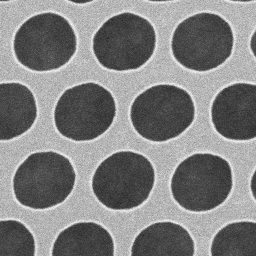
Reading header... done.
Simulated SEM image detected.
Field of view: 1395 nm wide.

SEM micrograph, a regular array of holes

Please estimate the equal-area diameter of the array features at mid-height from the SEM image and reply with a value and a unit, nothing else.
330 nm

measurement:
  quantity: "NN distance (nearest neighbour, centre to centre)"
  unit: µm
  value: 0.425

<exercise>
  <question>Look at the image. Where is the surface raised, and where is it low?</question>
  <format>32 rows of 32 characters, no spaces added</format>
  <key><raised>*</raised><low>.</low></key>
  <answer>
********************************
********************************
***.....*****.....*****.....****
**.......***.......***.......***
**.......***.......***.......***
**........**.......**........**.
**.......***.......***.......***
**.......***.......***......****
****...******....******....*****
********************************
...*******..*****************..*
....****......****.....****.....
....***.......***.......***.....
.....**.......**........**......
.....**.......**........**......
....***.......***.......***.....
...****......****......****.....
.********..********..********..*
********************************
****....******....******...*****
***......****......***.......***
**.......***.......***.......***
**.......***.......**........**.
**.......***.......**........**.
**.......***.......***......****
***....******.....****......****
********************************
********************************
...*****.....*****.....*****....
....***.......***.......***.....
....***.......***.......**......
....***.......**........**......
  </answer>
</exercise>